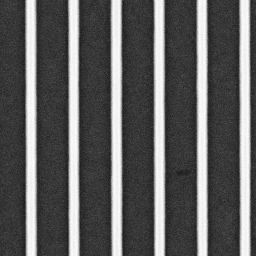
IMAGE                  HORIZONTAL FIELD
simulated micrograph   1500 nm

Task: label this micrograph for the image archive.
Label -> parallel lines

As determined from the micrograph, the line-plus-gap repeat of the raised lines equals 251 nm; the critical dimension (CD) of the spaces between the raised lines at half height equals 202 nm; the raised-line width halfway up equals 49.1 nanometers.